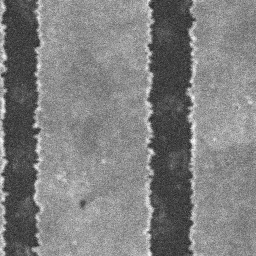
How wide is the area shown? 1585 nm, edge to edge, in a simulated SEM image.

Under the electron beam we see one or a few lines or trenches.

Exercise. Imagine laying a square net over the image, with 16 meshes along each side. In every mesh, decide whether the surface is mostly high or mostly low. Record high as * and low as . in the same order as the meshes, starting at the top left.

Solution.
..*******...****
..*******...****
..*******...****
..*******...****
..*******...****
..*******...****
..*******...****
..*******...****
..*******...****
..*******...****
..*******...****
..*******...****
..*******...****
..*******...****
..*******...****
..*******...****